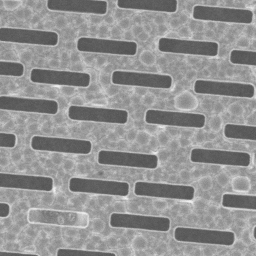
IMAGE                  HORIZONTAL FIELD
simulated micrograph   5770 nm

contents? a regular array of holes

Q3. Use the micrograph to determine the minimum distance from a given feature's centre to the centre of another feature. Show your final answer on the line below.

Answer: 47.8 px